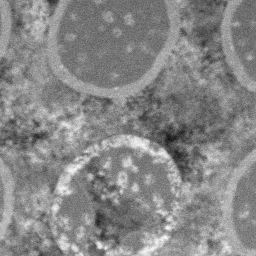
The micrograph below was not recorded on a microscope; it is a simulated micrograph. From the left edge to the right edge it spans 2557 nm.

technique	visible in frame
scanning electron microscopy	raised bodies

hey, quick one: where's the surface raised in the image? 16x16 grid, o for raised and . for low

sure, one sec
....ooooooo...oo
...oooooooo...oo
...oooooooo...oo
...ooooooo....oo
....oooooo.....o
......oo........
................
................
................
................
...............o
...............o
o.............oo
..............oo
..............oo
...............o